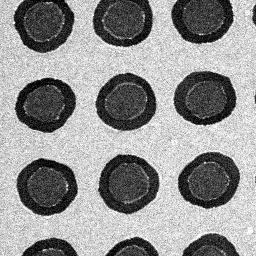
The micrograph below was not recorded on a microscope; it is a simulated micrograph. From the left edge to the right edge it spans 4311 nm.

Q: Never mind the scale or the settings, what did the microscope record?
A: ring-shaped grooves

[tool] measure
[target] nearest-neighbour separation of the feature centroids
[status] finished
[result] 1360 nm